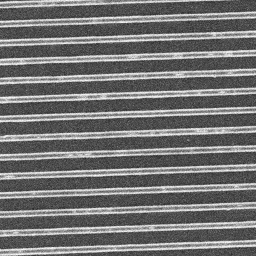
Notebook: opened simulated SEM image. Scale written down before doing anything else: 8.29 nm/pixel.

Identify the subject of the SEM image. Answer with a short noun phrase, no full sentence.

parallel lines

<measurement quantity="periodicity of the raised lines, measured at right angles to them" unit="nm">158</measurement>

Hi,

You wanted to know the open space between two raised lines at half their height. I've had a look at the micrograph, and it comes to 114 nm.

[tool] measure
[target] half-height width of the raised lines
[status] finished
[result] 0.0445 um